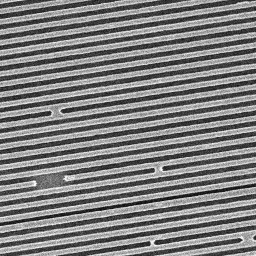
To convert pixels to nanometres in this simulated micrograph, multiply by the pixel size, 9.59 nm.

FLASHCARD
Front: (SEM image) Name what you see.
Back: parallel lines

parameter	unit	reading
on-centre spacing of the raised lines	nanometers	98.7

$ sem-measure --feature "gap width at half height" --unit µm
0.051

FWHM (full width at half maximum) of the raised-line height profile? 0.051 micrometres